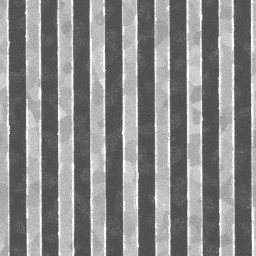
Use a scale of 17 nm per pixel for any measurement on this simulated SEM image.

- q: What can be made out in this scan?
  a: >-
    parallel lines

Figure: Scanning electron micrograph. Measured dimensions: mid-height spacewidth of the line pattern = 300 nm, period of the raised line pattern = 548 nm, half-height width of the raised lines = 245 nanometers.